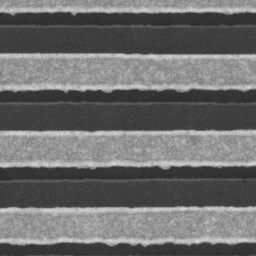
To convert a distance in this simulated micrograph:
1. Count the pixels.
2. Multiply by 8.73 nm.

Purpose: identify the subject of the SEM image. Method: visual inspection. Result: lines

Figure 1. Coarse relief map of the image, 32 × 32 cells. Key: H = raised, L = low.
HHHHHHHHHHHHHHHHHHHHHHHHHHHHHHHH
HHHLHHHLLHHHHHHHHHHHHHHHHHLHHHHH
LLLLLLLLLLLLLLLLLLLLLLLLLLLLLLLL
LLLLLLLLLLLLLLLLLLLLLLLLLLLLLLLL
LLLLLLLLLLLLLLLLLLLLLLLLLLLLLLLL
LLLLLLLLLLLLLLLLLLLLLLLLLLLLLLLL
LLLLLLLLLLLLLLLLLLLLLLLLLLLLLLLL
HHHHHHHHHHHHHHHHHHHHHHHHHHHHHHHH
HHHHHHHHHHHHHHHHHHHHHHHHHHHHHHHH
HHHHHHHHHHHHHHHHHHHHHHHHHHHHHHHH
HHHHHHHHHHHHHHHHHHHHHHHHHHHHHHHH
LLLLLLLLLLLLLLLLLLLLLLLLLLLLLLLL
LLLLLLLLLLLLLLLLLLLLLLLLLLLLLLLL
LLLLLLLLLLLLLLLLLLLLLLLLLLLLLLLL
LLLLLLLLLLLLLLLLLLLLLLLLLLLLLLLL
LLLLLLLLLLLLLLLLLLLLLLLLLLLLLLLL
LHHHLHLHHHLLHHHHHHHHHHHHHHHHHHHH
HHHHHHHHHHHHHHHHHHHHHHHHHHHHHHHH
HHHHHHHHHHHHHHHHHHHHHHHHHHHHHHHH
HHHHHHHHHHHHHHHHHHHHHHHHHHHHHHHH
HHHHHHHHHHHHHHHHHHHHHHHHHHHHHHHH
LLLLLLLLLLLLLLLLLLLLLLLLLLLLLLLL
LLLLLLLLLLLLLLLLLLLLLLLLLLLLLLLL
LLLLLLLLLLLLLLLLLLLLLLLLLLLLLLLL
LLLLLLLLLLLLLLLLLLLLLLLLLLLLLLLL
LLLLLLLLLLLLLLLLLLLLLLLLLLLLLLLL
HHHHHHHHHHHHHHHHHHHHHHHHHHHHHHHH
HHHHHHHHHHHHHHHHHHHHHHHHHHHHHHHH
HHHHHHHHHHHHHHHHHHHHHHHHHHHHHHHH
HHHHHHHHHHHHHHHHHHHHHHHHHHHHHHHH
LLLLLHLLLLLLLLLLLLLLLLLLLLLLLLLL
LLLLLLLLLLLLLLLLLLLLLLLLLLLLLLLL